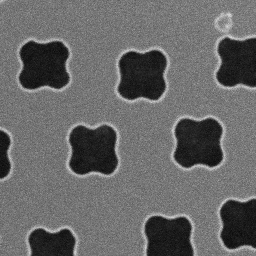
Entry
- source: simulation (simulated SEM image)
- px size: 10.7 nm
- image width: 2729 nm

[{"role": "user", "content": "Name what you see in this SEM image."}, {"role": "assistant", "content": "holes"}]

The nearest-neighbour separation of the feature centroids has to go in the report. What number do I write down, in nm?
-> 948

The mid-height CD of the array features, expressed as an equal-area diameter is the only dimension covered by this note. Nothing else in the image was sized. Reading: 553 nm